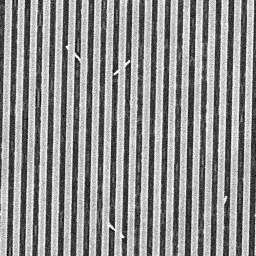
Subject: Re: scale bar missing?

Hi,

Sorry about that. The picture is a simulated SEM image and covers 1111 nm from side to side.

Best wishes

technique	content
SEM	parallel lines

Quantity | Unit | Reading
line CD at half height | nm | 28.8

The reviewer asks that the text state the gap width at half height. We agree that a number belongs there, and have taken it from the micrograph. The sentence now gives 28.8 nanometers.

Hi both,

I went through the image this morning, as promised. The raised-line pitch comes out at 55.3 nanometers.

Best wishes